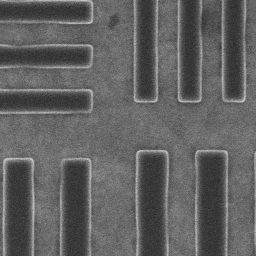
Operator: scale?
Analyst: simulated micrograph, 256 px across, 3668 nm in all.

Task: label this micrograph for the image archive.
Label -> groups of lines, slits or small figures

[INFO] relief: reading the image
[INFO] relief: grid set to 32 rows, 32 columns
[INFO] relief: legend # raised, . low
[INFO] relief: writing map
###########......###..###...###.
###########......###..###...###.
###########......###..###...###.
.................###..###...###.
.................###..###...##..
.................###..###...###.
###########......###..###...###.
###########......###..###...###.
.................###..###...###.
.................###..###...###.
.................###..###...###.
###########......###..###...###.
###########......##....##...##..
###########.....................
................................
................................
................................
................................
................................
.................####....###....
.###....###......####....###....
.###....###......####....###....
.###....###......####....###....
####....###......####....###....
####....###......####....###....
.###....###......####....###....
####....###......####....###....
####....###......####....###....
####....###......####....###....
####....###......####....###....
####....###......####....###....
.###....###......####....###....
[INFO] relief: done